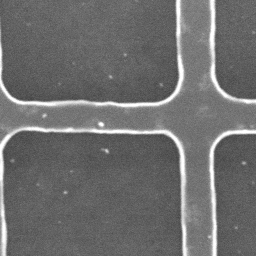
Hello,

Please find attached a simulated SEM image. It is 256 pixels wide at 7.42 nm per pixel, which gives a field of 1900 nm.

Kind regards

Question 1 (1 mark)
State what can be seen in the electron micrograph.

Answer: holes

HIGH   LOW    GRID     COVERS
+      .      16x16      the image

...........++...
...........++...
...........++...
...........++...
...........++...
...........+++..
++++++++++++++++
++++++++++++++++
+..........+++..
...........++...
...........++...
...........++...
...........++...
...........++...
...........+++..
...........++...